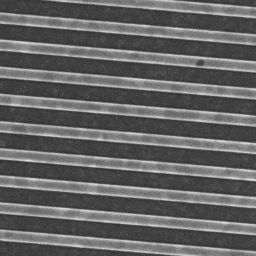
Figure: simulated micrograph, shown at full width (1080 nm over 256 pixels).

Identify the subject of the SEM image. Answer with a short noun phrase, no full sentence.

parallel lines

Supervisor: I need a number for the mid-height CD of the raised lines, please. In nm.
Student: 43.3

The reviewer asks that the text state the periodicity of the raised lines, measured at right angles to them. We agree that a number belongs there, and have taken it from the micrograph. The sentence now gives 114 nanometers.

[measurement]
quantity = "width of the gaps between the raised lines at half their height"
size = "72 nm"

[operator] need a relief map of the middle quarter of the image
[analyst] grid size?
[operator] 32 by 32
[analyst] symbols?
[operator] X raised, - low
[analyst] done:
-------------------------------X
--------------------------------
XXXX----------------------------
XXXXXXXXXXXXXXXX----------------
XXXXXXXXXXXXXXXXXXXXXXXXXXX-----
-----------XXXXXXXXXXXXXXXXXXXXX
-----------------------XXXXXXXXX
--------------------------------
--------------------------------
XXXXXX--------------------------
XXXXXXXXXXXXXXXXX---------------
-XXXXXXXXXXXXXXXXXXXXXXXXXXXX---
-------------XXXXXXXXXXXXXXXXXXX
------------------------XXXXXXXX
--------------------------------
--------------------------------
XXXXXXX-------------------------
XXXXXXXXXXXXXXXXXXX-------------
--XXXXXXXXXXXXXXXXXXXXXXXXXXXX--
--------------XXXXXXXXXXXXXXXXXX
--------------------------XXXXXX
--------------------------------
--------------------------------
XXXXXXXXXXX---------------------
XXXXXXXXXXXXXXXXXXXXXXX---------
------XXXXXXXXXXXXXXXXXXXXXXXXXX
------------------XXXXXXXXXXXXXX
------------------------------XX
--------------------------------
X-------------------------------
XXXXXXXXXXXX--------------------
XXXXXXXXXXXXXXXXXXXXXXXX--------